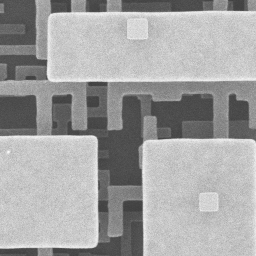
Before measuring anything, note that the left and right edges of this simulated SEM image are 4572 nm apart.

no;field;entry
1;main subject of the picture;wiring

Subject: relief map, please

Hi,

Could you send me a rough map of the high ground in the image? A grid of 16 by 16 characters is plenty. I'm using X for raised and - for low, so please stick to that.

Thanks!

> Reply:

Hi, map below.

----------------
---XXXXXXXXXXXXX
---XXXXXXXXXXXXX
---XXXXXXXXXXXXX
---XXXXXXXXXXXXX
----------------
----------------
----------------
----------------
XXXXXX---XXXXXXX
XXXXXX---XXXXXXX
XXXXXX---XXXXXXX
XXXXXX---XXXXXXX
XXXXXX---XXXXXXX
XXXXXX---XXXXXXX
XX--XX---XXXXXXX